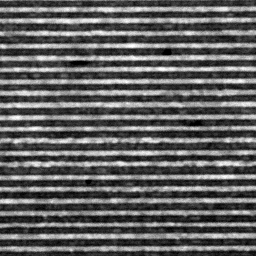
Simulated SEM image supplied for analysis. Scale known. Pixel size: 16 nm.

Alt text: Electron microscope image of parallel lines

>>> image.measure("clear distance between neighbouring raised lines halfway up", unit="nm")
126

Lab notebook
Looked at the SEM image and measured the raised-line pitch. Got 191 nm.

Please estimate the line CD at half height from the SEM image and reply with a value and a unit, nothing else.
55.9 nm